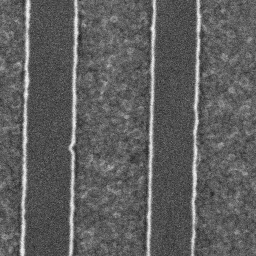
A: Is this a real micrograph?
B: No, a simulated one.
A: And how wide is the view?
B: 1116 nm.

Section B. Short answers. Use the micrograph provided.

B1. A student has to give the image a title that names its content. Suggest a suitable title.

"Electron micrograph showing one or a few lines or trenches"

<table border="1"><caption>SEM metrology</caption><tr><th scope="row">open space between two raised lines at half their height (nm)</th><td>335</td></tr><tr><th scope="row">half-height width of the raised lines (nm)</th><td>206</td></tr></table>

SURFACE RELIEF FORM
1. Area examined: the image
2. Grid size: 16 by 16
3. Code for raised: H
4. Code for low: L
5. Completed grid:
LLHHHLLLLLHHLLLL
LLHHHLLLLLHHLLLL
LLHHHLLLLLHHLLLL
LLHHHLLLLLHHLLLL
LLHHHLLLLHHHLLLL
LLHHHLLLLLHHLLLL
LLHHHLLLLHHHLLLL
LLHHHLLLLHHHLLLL
LLHHHLLLLHHHLLLL
LHHHHLLLLHHHLLLL
LLHHHLLLLHHHLLLL
LHHHHLLLLHHHLLLL
LHHHHLLLLHHHLLLL
LHHHLLLLLHHHLLLL
LHHHHLLLLHHHLLLL
LHHHLLLLLHHHLLLL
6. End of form